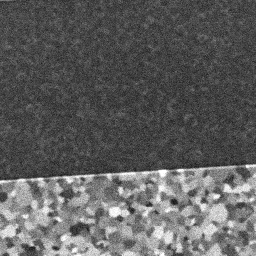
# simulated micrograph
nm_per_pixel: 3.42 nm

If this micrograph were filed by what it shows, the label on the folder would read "one or a few lines or trenches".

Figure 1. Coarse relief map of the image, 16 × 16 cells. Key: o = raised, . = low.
................
................
................
................
................
................
................
................
................
................
.............ooo
oooooooooooooooo
oooooooooooooooo
oooooooooooooooo
oooooooooooooooo
oooooooooooooooo